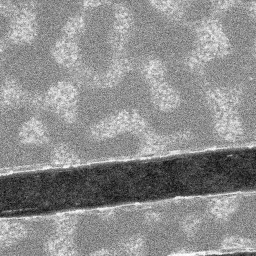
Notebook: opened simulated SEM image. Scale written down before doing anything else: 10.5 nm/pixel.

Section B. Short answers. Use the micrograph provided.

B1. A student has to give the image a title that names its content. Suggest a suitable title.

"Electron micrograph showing one or a few lines or trenches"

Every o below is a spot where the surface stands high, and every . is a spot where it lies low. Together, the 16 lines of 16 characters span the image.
oooooooooooooooo
oooooooooooooooo
oooooooooooooooo
oooooooooooooooo
oooooooooooooooo
oooooooooooooooo
oooooooooooooooo
oooooooooooooooo
oooooooooooooooo
ooooooooooooo...
oooo............
................
..........oooooo
..oooooooooooooo
oooooooooooooooo
oooooooooooooooo